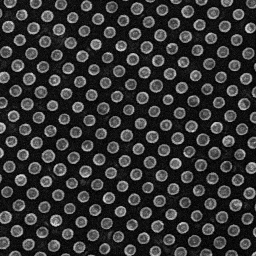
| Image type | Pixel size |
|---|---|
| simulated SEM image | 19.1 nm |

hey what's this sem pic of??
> a regular array of raised bodies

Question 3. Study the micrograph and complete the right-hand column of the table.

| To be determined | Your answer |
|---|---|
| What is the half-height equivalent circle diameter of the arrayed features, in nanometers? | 207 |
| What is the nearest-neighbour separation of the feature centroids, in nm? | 337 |